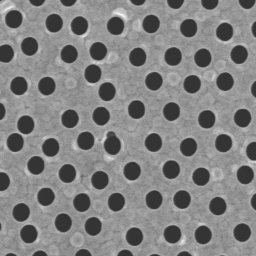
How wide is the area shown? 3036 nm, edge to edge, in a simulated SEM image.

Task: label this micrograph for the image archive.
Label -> a regular array of holes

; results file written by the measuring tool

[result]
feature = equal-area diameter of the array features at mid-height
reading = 216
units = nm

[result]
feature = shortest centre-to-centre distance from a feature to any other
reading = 338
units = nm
